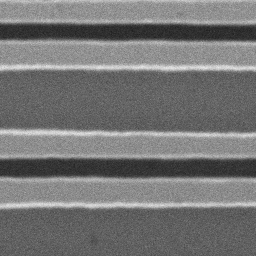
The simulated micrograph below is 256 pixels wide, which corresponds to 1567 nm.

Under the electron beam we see lines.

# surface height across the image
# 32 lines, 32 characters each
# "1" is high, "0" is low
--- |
11111111111111111111111111111111
11111111111111111111111111111111
11111111111111111111111111111111
00000000000000000000000000000000
00000000000000000000000000000000
11111111111111111111111111111111
11111111111111111111111111111111
11111111111111111111111111111111
00000000000000000000000000000001
00000000000000000000000000000000
00000000000000000000000000000000
00000000000000000000000000000000
00000000000000000000000000000000
00000000000000000000000000000000
00000000000000000000000000000000
00000000000000000000000000000000
00000000000000000000000000000000
11111111111111111111111111111111
11111111111111111111111111111111
11111111111111111111111111111111
00000000000000000000000000000000
00000000000000000000000000000000
11111111111111111111111111111111
11111111111111111111111111111111
11111111111111111111111111111111
11111011111111111111111111111111
00000000000000000000000000000000
00000000000000000000000000000000
00000000000000000000000000000000
00000000000000000000000000000000
00000000000000000000000000000000
00000000000000000000000000000000